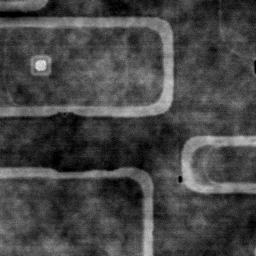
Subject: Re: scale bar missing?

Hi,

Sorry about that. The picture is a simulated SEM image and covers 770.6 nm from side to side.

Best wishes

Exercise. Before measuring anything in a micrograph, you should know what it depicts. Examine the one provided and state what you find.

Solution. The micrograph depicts wiring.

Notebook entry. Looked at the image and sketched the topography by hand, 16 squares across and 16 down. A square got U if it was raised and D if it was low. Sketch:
DDDDDDDDDDDDDDDD
UUUUUUUUUUDDDDDD
UUUUUUUUUUUDDDDD
UUUUUUUUUUUDDDDD
UUUUUUUUUUUDDDDD
UUUUUUUUUUUDDDDD
UUUUUUUUUUDDDDDD
DDDDDDDDDDDDDDDD
DDDDDDDDDDDDDDDD
DDDDDDDDDDDDUUUU
DDDDDDDDDDDDUUUU
UUUUUUUUUDDDUUUU
UUUUUUUUUDDDDDDD
UUUUUUUUUDDDDDDD
UUUUUUUUUDDDDDDD
UUUUUUUUUDDDDDDD